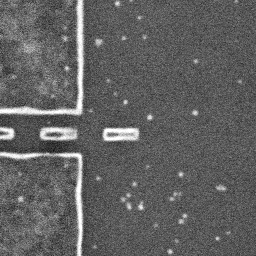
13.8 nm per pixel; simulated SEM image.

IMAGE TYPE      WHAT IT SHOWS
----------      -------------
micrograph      wiring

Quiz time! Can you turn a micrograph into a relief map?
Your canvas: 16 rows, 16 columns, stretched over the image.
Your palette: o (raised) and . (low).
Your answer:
ooooo...........
ooooo...........
ooooo...........
ooooo...........
ooooo...........
ooooo...........
ooooo...........
................
...o............
................
ooooo...........
ooooo...........
ooooo...........
ooooo...........
ooooo...........
ooooo...........